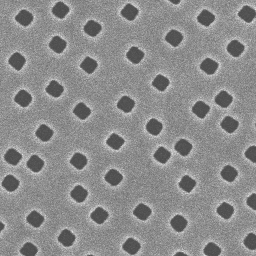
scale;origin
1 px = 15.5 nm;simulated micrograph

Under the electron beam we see a regular array of holes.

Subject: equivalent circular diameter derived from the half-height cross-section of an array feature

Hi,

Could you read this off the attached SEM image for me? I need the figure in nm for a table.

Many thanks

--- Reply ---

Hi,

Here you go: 266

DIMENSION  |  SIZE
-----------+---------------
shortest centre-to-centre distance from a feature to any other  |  549 nm